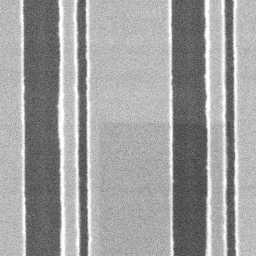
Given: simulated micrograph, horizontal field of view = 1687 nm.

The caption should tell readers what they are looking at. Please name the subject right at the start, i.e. lines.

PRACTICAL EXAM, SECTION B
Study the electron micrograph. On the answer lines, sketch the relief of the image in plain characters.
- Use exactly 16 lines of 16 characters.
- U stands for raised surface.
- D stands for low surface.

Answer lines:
UDDDUUUUUUUDDUUU
UDDDUUUUUUUDDUUU
UDDDUUUUUUUDDUUU
UDDDUUUUUUUDDUUU
UDDDUUUUUUUDDUUU
UDDDUUUUUUUDDUUU
UDDDUUUUUUUDDUUU
UDDDUUUUUUUDDUUU
UDDDUUUUUUUDDUUU
UDDDUUUUUUUDDUUU
UDDDUUUUUUUDDUUU
UDDDUUUUUUUDDUUU
UUDDUUUUUUUDDUUU
UUDDUUUUUUUDDUUU
UUDDUUUUUUUDDUUU
UUDDUUUUUUUDDUUU